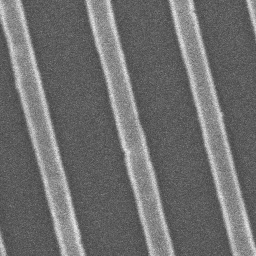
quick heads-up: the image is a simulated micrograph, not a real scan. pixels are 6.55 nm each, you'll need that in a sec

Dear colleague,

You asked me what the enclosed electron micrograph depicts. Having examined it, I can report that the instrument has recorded one or a few lines or trenches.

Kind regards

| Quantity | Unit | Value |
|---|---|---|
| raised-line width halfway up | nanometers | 130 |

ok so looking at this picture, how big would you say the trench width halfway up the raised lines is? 0.401 µm